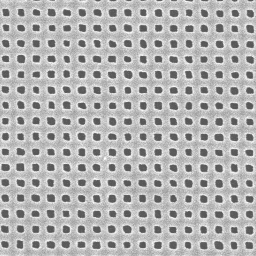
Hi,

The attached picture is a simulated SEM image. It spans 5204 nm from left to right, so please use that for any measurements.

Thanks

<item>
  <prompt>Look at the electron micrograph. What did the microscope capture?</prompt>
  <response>a regular array of holes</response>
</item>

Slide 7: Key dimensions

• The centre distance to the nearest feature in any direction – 306 nanometres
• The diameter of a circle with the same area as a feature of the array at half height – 167 nanometres